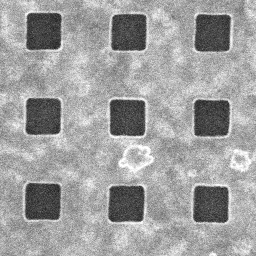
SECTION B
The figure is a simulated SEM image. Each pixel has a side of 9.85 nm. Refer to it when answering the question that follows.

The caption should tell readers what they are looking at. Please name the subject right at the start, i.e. a regular array of holes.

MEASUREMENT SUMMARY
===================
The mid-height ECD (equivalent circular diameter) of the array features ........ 404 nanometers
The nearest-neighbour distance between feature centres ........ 0.827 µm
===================